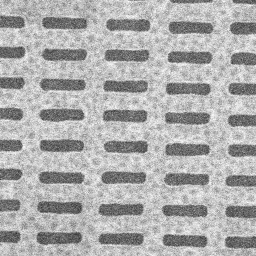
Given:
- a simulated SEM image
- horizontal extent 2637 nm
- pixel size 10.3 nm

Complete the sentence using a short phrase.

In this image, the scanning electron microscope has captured a regular array of holes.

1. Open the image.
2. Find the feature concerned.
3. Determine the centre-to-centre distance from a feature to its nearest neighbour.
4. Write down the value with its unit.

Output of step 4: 307 nm